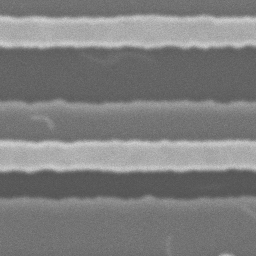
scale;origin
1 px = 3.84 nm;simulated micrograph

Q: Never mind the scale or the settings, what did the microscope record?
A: lines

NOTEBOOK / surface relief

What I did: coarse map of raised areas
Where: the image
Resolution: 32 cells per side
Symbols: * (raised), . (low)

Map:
********************************
********************************
********************************
********************************
********************************
********************************
................................
................................
................................
................................
................................
................................
................................
********************************
********************************
********************************
********************************
********************************
********************************
********************************
********************************
................................
................................
................................
................................
********************************
********************************
********************************
********************************
********************************
********************************
********************************